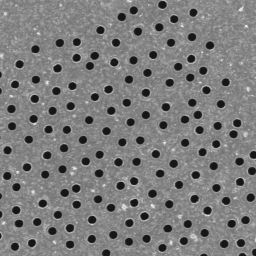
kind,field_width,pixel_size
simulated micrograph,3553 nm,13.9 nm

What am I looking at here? a regular array of holes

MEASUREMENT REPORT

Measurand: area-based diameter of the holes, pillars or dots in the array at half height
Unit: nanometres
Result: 112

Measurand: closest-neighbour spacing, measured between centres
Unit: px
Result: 17.6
